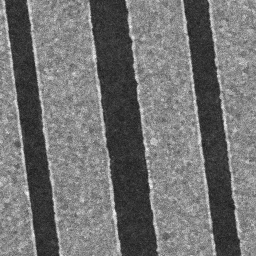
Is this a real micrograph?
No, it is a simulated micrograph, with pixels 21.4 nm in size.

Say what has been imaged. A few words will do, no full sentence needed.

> one or a few lines or trenches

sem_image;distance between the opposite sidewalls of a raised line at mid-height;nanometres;1210